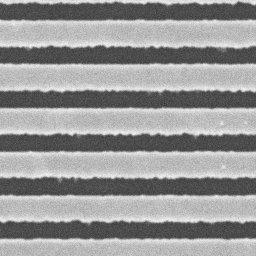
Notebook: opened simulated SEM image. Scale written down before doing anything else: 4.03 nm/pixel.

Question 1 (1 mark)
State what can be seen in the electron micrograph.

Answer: lines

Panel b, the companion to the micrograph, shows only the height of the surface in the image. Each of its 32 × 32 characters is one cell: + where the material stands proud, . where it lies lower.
................................
................................
................................
++++++++++++++++++++++++++++++++
++++++++++++++++++++++++++++++++
++++++++++++++++++++++++++++++++
................................
................................
++++++++++++++++++++++++++++++++
++++++++++++++++++++++++++++++++
++++++++++++++++++++++++++++++++
................................
................................
................+...............
++++++++++++++++++++++++++++++++
++++++++++++++++++++++++++++++++
++++++++++++++++++++++++++++++++
................................
................................
++++++++++++++++++++++++++++++++
++++++++++++++++++++++++++++++++
++++++++++++++++++++++++++++++++
................................
................................
++...++.++...++..+.+++++..++++++
++++++++++++++++++++++++++++++++
++++++++++++++++++++++++++++++++
+++++++++.++++++++++++++++++++++
................................
................................
++++++++++++++++++++++++++++++++
++++++++++++++++++++++++++++++++